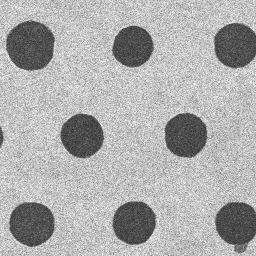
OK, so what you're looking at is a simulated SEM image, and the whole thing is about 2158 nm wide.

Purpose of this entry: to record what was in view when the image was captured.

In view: holes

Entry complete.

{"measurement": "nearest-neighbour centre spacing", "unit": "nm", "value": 856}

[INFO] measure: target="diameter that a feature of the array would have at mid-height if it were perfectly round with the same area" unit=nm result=369